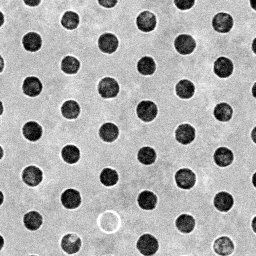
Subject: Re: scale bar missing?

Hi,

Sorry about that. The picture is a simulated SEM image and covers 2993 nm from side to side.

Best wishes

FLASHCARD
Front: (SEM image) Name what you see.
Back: a regular array of holes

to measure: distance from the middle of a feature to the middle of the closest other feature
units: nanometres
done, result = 511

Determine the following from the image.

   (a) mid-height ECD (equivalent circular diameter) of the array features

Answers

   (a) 246 nm